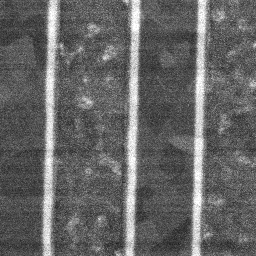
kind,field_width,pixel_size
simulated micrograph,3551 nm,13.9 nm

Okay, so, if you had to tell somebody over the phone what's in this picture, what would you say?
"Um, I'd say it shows one or a few lines or trenches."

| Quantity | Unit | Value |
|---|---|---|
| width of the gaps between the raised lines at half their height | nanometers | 1150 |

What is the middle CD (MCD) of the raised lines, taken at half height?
920 nm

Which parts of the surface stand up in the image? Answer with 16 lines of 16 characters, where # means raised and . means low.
###.....#####...
###......####...
###.....#####...
###.....#####...
###.....#####...
###.....####....
###.....####....
###.....####....
###.....####....
###.....####....
###.....####....
###.....####....
###.....####....
###.....####....
###.....####....
###.....####....